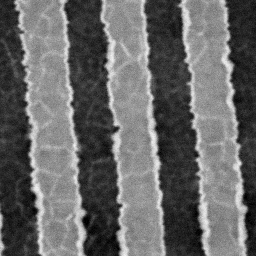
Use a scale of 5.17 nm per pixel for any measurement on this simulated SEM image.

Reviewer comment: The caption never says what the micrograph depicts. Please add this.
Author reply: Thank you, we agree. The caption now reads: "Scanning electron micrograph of one or a few lines or trenches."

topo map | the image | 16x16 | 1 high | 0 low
0111001110011100
0111000110011100
0111000110001100
0011000110001100
0011000110001100
0011000110001100
0011000111001110
0011000111001110
0011100111001110
0011100111001110
0011100111001110
0011100111000110
0011100111000110
0011100011001110
0011100111000110
0001100011000110